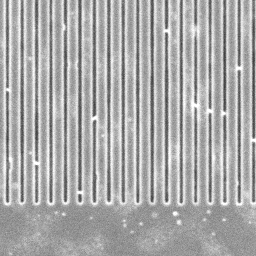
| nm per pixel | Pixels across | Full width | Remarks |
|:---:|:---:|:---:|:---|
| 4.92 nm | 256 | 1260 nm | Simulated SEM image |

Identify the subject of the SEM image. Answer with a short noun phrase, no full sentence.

parallel lines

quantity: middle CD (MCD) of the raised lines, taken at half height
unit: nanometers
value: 52.3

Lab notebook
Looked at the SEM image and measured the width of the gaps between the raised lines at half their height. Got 19.1 nanometres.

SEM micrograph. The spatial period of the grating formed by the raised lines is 0.0713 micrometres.